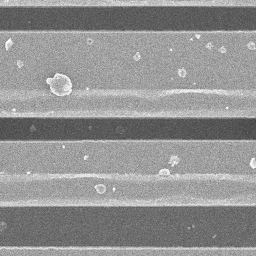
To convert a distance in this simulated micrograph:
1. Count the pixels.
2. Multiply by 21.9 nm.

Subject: lines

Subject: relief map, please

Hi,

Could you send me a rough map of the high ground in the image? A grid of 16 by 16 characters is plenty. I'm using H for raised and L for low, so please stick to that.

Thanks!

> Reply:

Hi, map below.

LLLLLLLLLLLLLLLL
LLLLLLLLLLLLLLLL
HHHHHHHHHHHHHHHH
HHHHHHHHHHHHHHHH
HHHHHHHHHHHHHHHH
HHHHHHHHHHHHHHHH
HHHHHHHHHHHHHHHH
LLLLLLLLLLLLLLLL
LLLLLLLLLLLLLLLL
HHHHHHHHHHHHHHHH
HHHHHHHHHHHHHHHH
HHHHHHHHHHHHHHHH
HHHHHHHHHHHHHHHH
LLLLLLLLLLLLLLLL
LLLLLLLLLLLLLLLL
HHHHHHHLHLLLLLLL